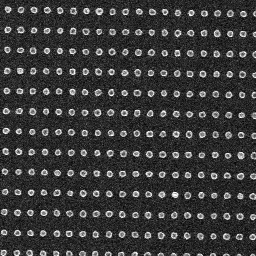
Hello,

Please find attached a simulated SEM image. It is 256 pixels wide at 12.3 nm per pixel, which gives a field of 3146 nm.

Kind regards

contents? a regular array of raised bodies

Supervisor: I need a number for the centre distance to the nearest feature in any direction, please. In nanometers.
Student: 159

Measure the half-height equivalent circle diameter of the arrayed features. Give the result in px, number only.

5.87